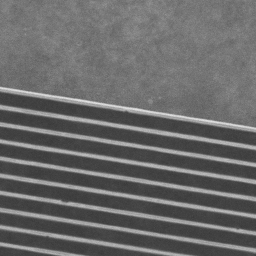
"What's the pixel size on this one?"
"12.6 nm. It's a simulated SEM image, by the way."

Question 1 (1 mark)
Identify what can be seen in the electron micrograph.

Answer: parallel lines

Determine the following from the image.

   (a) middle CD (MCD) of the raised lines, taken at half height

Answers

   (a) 3.08 pixels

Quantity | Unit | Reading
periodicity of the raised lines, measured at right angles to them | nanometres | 213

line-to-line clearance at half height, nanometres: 175